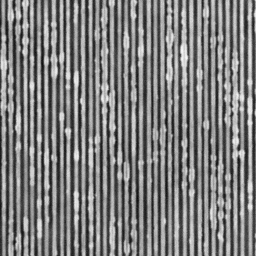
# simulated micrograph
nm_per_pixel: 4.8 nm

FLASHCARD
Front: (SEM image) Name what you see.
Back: parallel lines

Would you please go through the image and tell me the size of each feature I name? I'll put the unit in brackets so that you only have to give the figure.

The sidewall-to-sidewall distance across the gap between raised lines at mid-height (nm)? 17.4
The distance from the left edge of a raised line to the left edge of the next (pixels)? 7.25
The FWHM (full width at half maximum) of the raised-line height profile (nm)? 17.4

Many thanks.